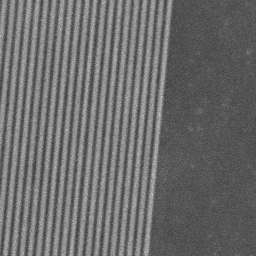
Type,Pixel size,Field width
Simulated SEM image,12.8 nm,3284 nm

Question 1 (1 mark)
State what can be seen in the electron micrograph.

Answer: parallel lines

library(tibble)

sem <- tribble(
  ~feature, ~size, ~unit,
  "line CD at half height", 43.2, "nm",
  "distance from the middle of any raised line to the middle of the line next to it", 0.105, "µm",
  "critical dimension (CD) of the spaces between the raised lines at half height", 5.11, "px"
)